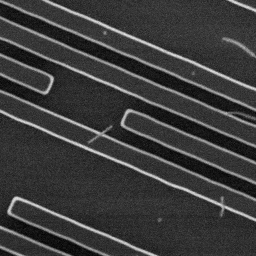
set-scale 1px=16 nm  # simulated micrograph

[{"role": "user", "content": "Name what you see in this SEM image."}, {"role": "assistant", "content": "groups of lines, slits or small figures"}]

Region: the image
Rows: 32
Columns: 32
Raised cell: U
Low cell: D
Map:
DUUUUUUDDDDDDDDDDDDDDDDDDDDDDDUU
DDDUUUUUUDDDDDDDDDDDDDDDDDDDDDDD
UDDDDDUUUUUUDDDDDDDDDDDDDDDDDDDD
UUUDDDDDUUUUUUDDDDDDDDDDDDDDDDDD
UUUUUDDDDDUUUUUUDDDDDDDDDDDDDDDD
DDUUUUUUDDDDDUUUUUDDDDDDDDDDDDDD
DDDDUUUUUUDDDDDUUUUUUDDDDDDDDDDD
UUDDDDUUUUUUDDDDDUUUUUUDDDDDDDDD
UUUUDDDDDUUUUUUDDDDDUUUUUUDDDDDD
UUUUUUDDDDDUUUUUUDDDDDUUUUUUDDDD
DDDUUUDDDDDDDDUUUUUDDDDDUUUUUUDD
DDDDDUDDDDDDDDDDUUUUUUDDDDDUUUUU
UUUDDDDDDDDDDDDDDDUUUUUUDDDDDUUU
UUUUUDDDDDDDDDDDDDDDUUUUUUDDDDDU
DUUUUUUDDDDDDDDDUUDDDDDUUUUUUDDD
DDDDUUUUUUDDDDDUUUUUDDDDDUUUUUUD
DDDDDDUUUUUUDDDDDUUUUUUDDDDDUUUU
DDDDDDDDUUUUUUDDDDDUUUUUUDDDDDUU
DDDDDDDDDDDUUUUUUDDDDUUUUUUUDDDD
DDDDDDDDDDDDDUUUUUUDDDDDUUUUUUDD
DDDDDDDDDDDDDDDDUUUUUUDDDDUUUUUU
DDDDDDDDDDDDDDDDDDUUUUUUDDDDDUUU
DDDDDDDDDDDDDDDDDDDDUUUUUUDDDDDU
DDDDDDDDDDDDDDDDDDDDDDDUUUUUUDDD
DDDDDDDDDDDDDDDDDDDDDDDDDUUUUUUD
DUUUDDDDDDDDDDDDDDDDDDDDDDDUUUUU
DUUUUUDDDDDDDDDDDDDDDDDDDDDDDUUU
DDDUUUUUUDDDDDDDDDDDDDDDDDDDDDDD
DDDDDUUUUUUDDDDDDDDDDDDDDDDDDDDD
UUUDDDDDUUUUUUDDDDDDDDDDDDDDDDDD
UUUUUDDDDDUUUUUUDDDDDDDDDDDDDDDD
DUUUUUUUDDDDUUUUUUDDDDDDDDDDDDDD